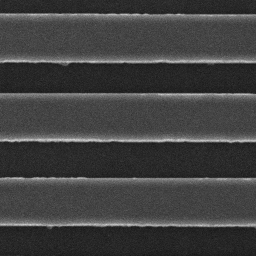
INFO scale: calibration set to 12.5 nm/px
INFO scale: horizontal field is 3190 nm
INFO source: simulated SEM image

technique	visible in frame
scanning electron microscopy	lines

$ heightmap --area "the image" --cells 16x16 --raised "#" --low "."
................
################
################
################
................
................
################
################
################
................
................
################
################
################
................
................